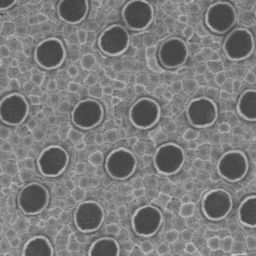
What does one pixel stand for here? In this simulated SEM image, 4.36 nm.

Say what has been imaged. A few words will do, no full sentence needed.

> a regular array of raised bodies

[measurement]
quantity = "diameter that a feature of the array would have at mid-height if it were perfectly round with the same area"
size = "134 nanometers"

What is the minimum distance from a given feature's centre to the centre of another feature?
217 nm